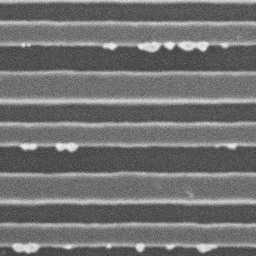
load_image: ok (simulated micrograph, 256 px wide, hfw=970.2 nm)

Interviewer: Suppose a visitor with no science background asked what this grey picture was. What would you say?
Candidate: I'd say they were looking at lines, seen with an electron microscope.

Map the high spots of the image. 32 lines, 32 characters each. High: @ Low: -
--------------------------------
--------------------------------
--------------------------------
@@@@@@@@@@@@@@@@@@@@@@@@@@@@@@@@
@@@@@@@@@@@@@@@@@@@@@@@@@@@@@@@@
@@@@@@@@@@@@@@@@@@@@@@@@@@@@@@@@
--------------------------------
--------------------------------
--------------------------------
@@@@@@@@@@@@@@@@@@@@@@@@@@@@@@@@
@@@@@@@@@@@@@@@@@@@@@@@@@@@@@@@@
@@@@@@@@@@@@@@@@@@@@@@@@@@@@@@@@
@@@@@@@@@@@@@@@@@@@@@@@@@@@@@@@@
--------------------------------
--------------------------------
-@-----@@@-----@--@@@@---@@--@@@
@@@@@@@@@@@@@@@@@@@@@@@@@@@@@@@@
@@@@@@@@@@@@@@@@@@@@@@@@@@@@@@@@
---@@--@@@----------------------
--------------------------------
--------------------------------
--------------------------------
@@@@@@@@@@@@@@@@@@@@@@@@@@@@@@@@
@@@@@@@@@@@@@@@@@@@@@@@@@@@@@@@@
@@@@@@@@@@@@@@@@@@@@@@@@@@@@@@@@
--------------------------------
--------------------------------
--------------------------------
@@@@@@@@@@@@@@@@@@@@@@@@@@@@@@@@
@@@@@@@@@@@@@@@@@@@@@@@@@@@@@@@@
@@@@@@@@@@@@@@@@@@@@@@@@@@@@@@@@
---@----------------------------